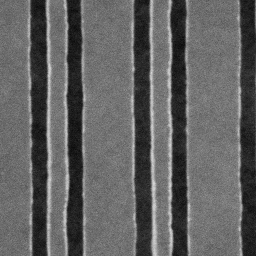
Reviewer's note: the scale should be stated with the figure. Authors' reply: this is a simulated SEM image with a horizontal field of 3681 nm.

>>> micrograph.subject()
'lines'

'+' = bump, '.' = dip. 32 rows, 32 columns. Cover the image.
++++..++..+++++++..++..+++++++..
++++..++..+++++++..++..+++++++..
++++..++..+++++++..++..+++++++..
++++..++..+++++++..++..+++++++..
++++..++..+++++++..++..+++++++..
++++..++..+++++++..++..+++++++..
++++..++..+++++++..++..+++++++..
++++..++..+++++++..++..+++++++..
++++..++..+++++++..++..+++++++..
++++..++..+++++++..++..+++++++..
++++..++..+++++++..++..+++++++..
++++..++..+++++++..++..+++++++..
++++..++..+++++++..++..+++++++..
++++..++..+++++++..++..+++++++..
++++..++..+++++++..++..+++++++..
++++..++..+++++++..++..+++++++..
++++..++..+++++++..+++.+++++++..
++++..++..+++++++..++..+++++++..
++++..++..+++++++..++..+++++++..
++++..++..+++++++..++..+++++++..
++++..++..+++++++..++..+++++++..
++++..+++.+++++++..++..+++++++..
++++..+++.+++++++..++..+++++++..
++++..+++.+++++++..++..+++++++..
++++..++..+++++++..++..+++++++..
++++..++..+++++++..++...++++++..
++++..++..+++++++..++...++++++..
++++..++..+++++++..++...++++++..
++++..++..+++++++..++...++++++..
++++..++..+++++++..+++..++++++..
++++..++..+++++++..+++..++++++..
++++..++..+++++++..+++..++++++..